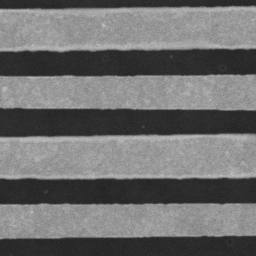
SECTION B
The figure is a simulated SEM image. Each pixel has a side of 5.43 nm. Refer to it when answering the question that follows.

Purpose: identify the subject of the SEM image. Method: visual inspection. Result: lines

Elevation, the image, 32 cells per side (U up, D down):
DDDDDDDDDDDDDDDDDDDDDDDDDDDDDDDD
UUUUUUUUUUUUUUUUUUUUUUUUUUUUUUUU
UUUUUUUUUUUUUUUUUUUUUUUUUUUUUUUU
UUUUUUUUUUUUUUUUUUUUUUUUUUUUUUUU
UUUUUUUUUUUUUUUUUUUUUUUUUUUUUUUU
UUUUUUUUUUUUUUUUUUUUUUUUUUUUUUUU
DDDDDDDDDDDDDDDDDDDDDDDDDDDDDDDD
DDDDDDDDDDDDDDDDDDDDDDDDDDDDDDDD
DDDDDDDDDDDDDDDDDDDDDDDDDDDDDDDD
DDDDDDDDDDDDDDDDDDDDDDDDDDUUUUUU
UUUUUUUUUUUUUUUUUUUUUUUUUUUUUUUU
UUUUUUUUUUUUUUUUUUUUUUUUUUUUUUUU
UUUUUUUUUUUUUUUUUUUUUUUUUUUUUUUU
UUUUUUUUUUUUUUUUUUUUUUUUUUUUUUUU
DDDDDDDDDDDDDDDDDDDDDDDDDDDDDDDD
DDDDDDDDDDDDDDDDDDDDDDDDDDDDDDDD
DDDDDDDDDDDDDDDDDDDDDDDDDDDDDDDD
UUUUUUUUUUUUUUUUUUUUUUUUUUUUUUUU
UUUUUUUUUUUUUUUUUUUUUUUUUUUUUUUU
UUUUUUUUUUUUUUUUUUUUUUUUUUUUUUUU
UUUUUUUUUUUUUUUUUUUUUUUUUUUUUUUU
UUUUUUUUUUUUUUUUUUUUUUUUUUUUUUUU
DDDDDDDDDDDDDDDDDDDDDDDDDDDDDDDD
DDDDDDDDDDDDDDDDDDDDDDDDDDDDDDDD
DDDDDDDDDDDDDDDDDDDDDDDDDDDDDDDD
DDDDDDDDDDDDDDDDDDDDDDDDDDDDDDDD
UUUUUUUUUUUUUUUUUUUUUUUUUUUUUUUU
UUUUUUUUUUUUUUUUUUUUUUUUUUUUUUUU
UUUUUUUUUUUUUUUUUUUUUUUUUUUUUUUU
UUUUUUUUUUUUUUUUUUUUUUUUUUUUDDDD
DDDDDDDDDDDDDDDDDDDDDDDDDDDDDDDD
DDDDDDDDDDDDDDDDDDDDDDDDDDDDDDDD